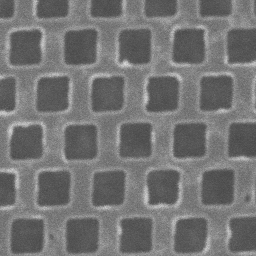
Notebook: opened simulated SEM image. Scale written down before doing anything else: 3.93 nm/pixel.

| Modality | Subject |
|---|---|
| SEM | a regular array of holes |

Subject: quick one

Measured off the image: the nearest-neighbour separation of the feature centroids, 210 nanometres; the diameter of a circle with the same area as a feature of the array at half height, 38.4 pixels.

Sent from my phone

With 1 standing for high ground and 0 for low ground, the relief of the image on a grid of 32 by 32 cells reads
00111000011000011100001110000111
00110000011000011100001110000111
11111111111111111111110111111111
11111111111111111111111011111110
10000111000011100001110000110000
10000111000011100001110000110000
10000111000011100001110000110000
10000111000011100001110000110000
11111111111111111111111111111111
11111110111111011111001111000111
00111000011000001100001110000111
00110000011000001100001110000111
00110000011000001110001110000111
00111000111000011100001110000111
11111111111111111111111111111111
11111111100111100001110000111000
11000111000011100001110000110000
10000111000011100001110000110000
10000011000011100001110000110000
10000111000011100001110001111000
11111111111111111111111111111111
11111000011100001110001111000111
00111000011100001100001110000111
00111000011000001100001110000111
00111000011000001110001110000100
00111000111100011110001110000111
11111111111111111111111111111111
11000111100011100001110000111000
10000011000011100001110000111000
10000001000011100001110000111000
10000001000011100001110000110000
10000111000011100001110001111001